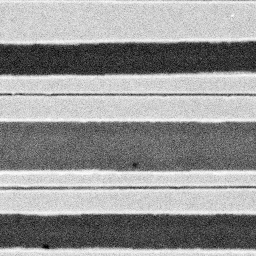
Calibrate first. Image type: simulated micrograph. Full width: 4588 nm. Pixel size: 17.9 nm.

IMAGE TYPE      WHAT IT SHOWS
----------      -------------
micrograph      lines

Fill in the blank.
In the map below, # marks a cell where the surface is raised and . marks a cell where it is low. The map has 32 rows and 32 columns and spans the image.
################################
################################
################################
################################
################################
................................
................................
................................
................................
..............##################
################################
################################
################################
################################
################################
................................
................................
................................
................................
................................
................................
................................
################################
################################
################################
################################
################################
................................
................................
................................
................................
################################